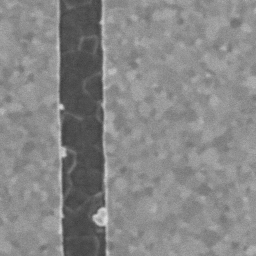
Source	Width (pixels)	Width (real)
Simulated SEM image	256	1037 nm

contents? one or a few lines or trenches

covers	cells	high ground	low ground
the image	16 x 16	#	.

####..##########
####..##########
####..##########
####..##########
####..##########
####..##########
####..##########
####...#########
####..##########
####...#########
####...#########
####...#########
####...#########
####..##########
####...#########
####...#########